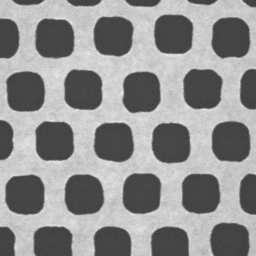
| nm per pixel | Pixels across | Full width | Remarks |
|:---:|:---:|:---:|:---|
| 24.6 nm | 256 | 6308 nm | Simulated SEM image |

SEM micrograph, a regular array of holes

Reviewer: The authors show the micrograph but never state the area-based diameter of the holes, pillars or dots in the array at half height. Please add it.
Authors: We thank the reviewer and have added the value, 1030 nanometers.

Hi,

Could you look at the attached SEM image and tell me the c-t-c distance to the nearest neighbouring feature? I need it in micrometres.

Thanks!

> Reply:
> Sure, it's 1.43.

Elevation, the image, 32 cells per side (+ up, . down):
++...++++...++++....++++...++++.
++++++++++++++++++++++++++++++++
.++++...++++....++++....+++...++
..+++....+++.....++.....+++....+
..++.....+++.....++.....+++....+
..++.....+++.....++.....++.....+
..+++....+++....++++...++++....+
++++++++++++++++++++++++++++++++
++++++++++++++++++++++++++++++++
+....+++....++++....+++....+++..
+.....++.....++.....+++.....++..
+.....++.....++.....+++.....++..
+....+++.....++.....+++.....++..
+....++++...++++...+++++...++++.
++++++++++++++++++++++++++++++++
.++++...+++++...++++...++++...++
..++.....+++....+++.....++.....+
..++.....+++.....++.....++.....+
..++.....+++.....++.....++.....+
.++++....+++....+++.....+++....+
++++++++++++++++++++++++++++++++
++++++++++++++++++++++++++++++++
+....+++....++++....+++....+++..
+.....++.....++.....+++....+++..
+.....++.....++.....+++.....++..
+.....++.....++.....+++....+++..
++...++++...++++...+++++...++++.
++++++++++++++++++++++++++++++++
.++++...+++++..+++++..+++++....+
..++.....+++....+++....+++.....+
..++.....+++....+++.....++.....+
..++.....+++....+++.....++.....+